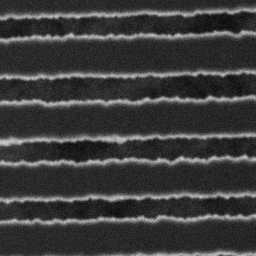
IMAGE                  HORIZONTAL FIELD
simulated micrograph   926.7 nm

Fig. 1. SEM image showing lines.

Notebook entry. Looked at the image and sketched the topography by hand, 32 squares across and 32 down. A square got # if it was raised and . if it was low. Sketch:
################################
##############################..
................................
................................
........#.##.#..################
################################
################################
################################
################################
#########.########.##...........
................................
................................
..................##############
################################
################################
################################
################################
##########.#....................
................................
................................
################################
################################
################################
################################
#######################.###.##.#
................................
................................
....#......#####################
################################
################################
################################
################################